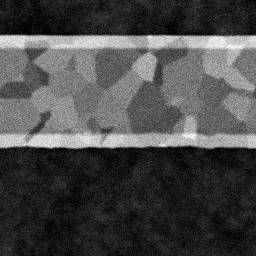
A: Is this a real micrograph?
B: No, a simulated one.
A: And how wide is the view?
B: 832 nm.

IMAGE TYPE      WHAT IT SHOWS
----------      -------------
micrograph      one or a few lines or trenches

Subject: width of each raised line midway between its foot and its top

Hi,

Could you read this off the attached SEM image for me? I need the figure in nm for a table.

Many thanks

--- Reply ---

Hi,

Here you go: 325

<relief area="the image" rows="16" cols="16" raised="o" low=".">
................
................
................
oooooooooooooooo
oooooooooooooooo
oooooooooooooooo
oooooooooooooooo
oooooooooooooooo
oooooooooooooooo
................
................
................
................
................
................
................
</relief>